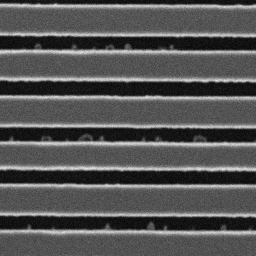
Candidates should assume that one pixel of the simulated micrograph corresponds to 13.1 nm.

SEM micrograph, lines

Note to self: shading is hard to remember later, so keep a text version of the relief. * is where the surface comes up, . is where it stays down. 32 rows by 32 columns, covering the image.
................................
********************************
********************************
********************************
.............................**.
................................
********************************
********************************
********************************
********************************
................................
................................
********************************
********************************
********************************
********************************
................................
................................
********************************
********************************
********************************
................................
................................
********************************
********************************
********************************
********************************
................................
................................
********************************
********************************
********************************